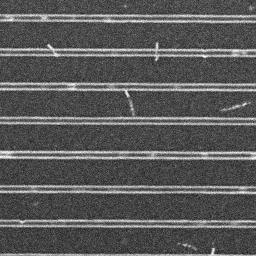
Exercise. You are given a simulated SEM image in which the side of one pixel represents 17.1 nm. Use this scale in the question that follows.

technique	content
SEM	parallel lines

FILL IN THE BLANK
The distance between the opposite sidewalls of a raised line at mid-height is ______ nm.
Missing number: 118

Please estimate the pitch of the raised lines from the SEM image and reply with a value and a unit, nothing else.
587 nanometers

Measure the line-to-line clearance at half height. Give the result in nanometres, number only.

474